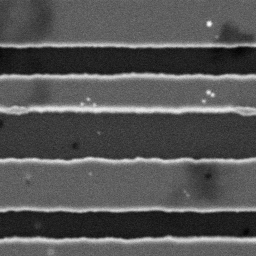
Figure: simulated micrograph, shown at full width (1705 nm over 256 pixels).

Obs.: lines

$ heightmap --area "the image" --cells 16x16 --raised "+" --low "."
++++++++++++++++
++++++++++++++++
++++++++++++++++
................
................
++++++++++++++++
++++++++++++++++
................
................
................
++++++++++++++++
++++++++++++++++
++++++++++++++++
................
................
++++++++++++++++